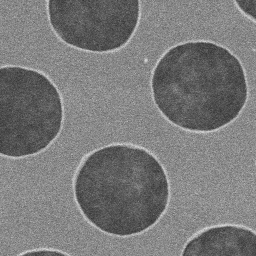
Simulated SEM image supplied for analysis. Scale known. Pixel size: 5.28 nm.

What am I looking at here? holes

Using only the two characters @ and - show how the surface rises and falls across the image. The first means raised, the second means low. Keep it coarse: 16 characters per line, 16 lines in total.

@@@------@@@@@@-
@@@------@@@@@@@
@@@@----@@@@@@@@
@@@@@@@@@@-----@
--@@@@@@@@-----@
---@@@@@@@-----@
----@@@@@@-----@
----@@@@@@@----@
---@@@@@@@@@@@@@
--@@@@---@@@@@@@
@@@@@-----@@@@@@
@@@@@-----@@@@@@
@@@@@-----@@@@@@
@@@@@-----@@@@@@
@@@@@@@--@@@@---
@@@@@@@@@@@@----